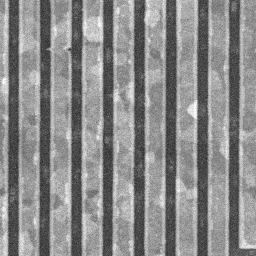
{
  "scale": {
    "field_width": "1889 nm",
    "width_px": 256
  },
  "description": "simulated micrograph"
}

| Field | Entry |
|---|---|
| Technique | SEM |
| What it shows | parallel lines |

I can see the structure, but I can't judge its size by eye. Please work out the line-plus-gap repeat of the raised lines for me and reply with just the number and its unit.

232 nm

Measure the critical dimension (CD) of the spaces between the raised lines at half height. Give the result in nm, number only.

100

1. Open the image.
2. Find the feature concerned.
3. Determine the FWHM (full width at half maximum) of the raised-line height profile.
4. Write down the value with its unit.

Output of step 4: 137 nanometres